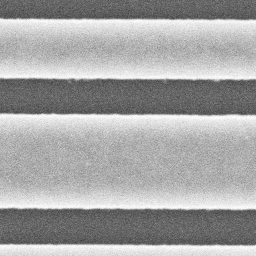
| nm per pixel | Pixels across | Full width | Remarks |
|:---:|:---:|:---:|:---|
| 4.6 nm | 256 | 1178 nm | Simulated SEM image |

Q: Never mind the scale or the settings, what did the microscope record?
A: lines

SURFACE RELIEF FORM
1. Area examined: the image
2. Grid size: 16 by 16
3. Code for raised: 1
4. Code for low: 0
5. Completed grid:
0000000000000000
1111111111111111
1111111111111111
1111111111111111
1111111111111111
0000000000000000
0000000000000000
1111111111111111
1111111111111111
1111111111111111
1111111111111111
1111111111111111
1111111111111111
0000000000000000
0000000000000000
1111111111111111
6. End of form